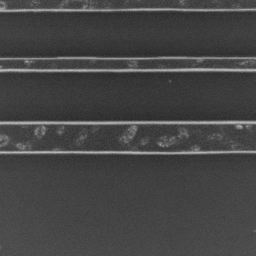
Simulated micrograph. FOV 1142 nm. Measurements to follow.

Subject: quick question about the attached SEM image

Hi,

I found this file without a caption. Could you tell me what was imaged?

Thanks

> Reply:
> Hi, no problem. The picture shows one or a few lines or trenches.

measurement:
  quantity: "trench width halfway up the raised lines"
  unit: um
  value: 0.223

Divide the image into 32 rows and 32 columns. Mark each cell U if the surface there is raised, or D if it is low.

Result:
UUUUUUUUUUUUUUUUUUUUUUUUUUUUUUUU
DDDDDDDDDDDDDDDDDDDDDDDDDDDDDDDD
DDDDDDDDDDDDDDDDDDDDDDDDDDDDDDDD
DDDDDDDDDDDDDDDDDDDDDDDDDDDDDDDD
DDDDDDDDDDDDDDDDDDDDDDDDDDDDDDDD
DDDDDDDDDDDDDDDDDDDDDDDDDDDDDDDD
DDDDDDDDDDDDDDDDDDDDDDDDDDDDDDDD
UUUUUUUUUUUUUUUUUUUUUUUUUUUUUUUU
UUUUUUUUUUUUUUUUUUUUUUUUUUUUUUUU
DDDDDDDDDDDDDDDDDDDDDDDDDDDDDDDD
DDDDDDDDDDDDDDDDDDDDDDDDDDDDDDDD
DDDDDDDDDDDDDDDDDDDDDDDDDDDDDDDD
DDDDDDDDDDDDDDDDDDDDDDDDDDDDDDDD
DDDDDDDDDDDDDDDDDDDDDDDDDDDDDDDD
DDDDDDDDDDDDDDDDDDDDDDDDDDDDDDDD
UUUUUUUUUUUUUUUUUUUUUUUUUUUUUUUU
UUUUUUUUUUUUUUUUUUUUUUUUUUUUUUUU
UUUUUUUUUUUUUUUUUUUUUUUUUUUUUUUU
UUUUUUUUUUUUUUUUUUUUUUUUUUUUUUUU
DDDDDDDDDDDDDDDDDDDDDDDDDDDDDDDD
DDDDDDDDDDDDDDDDDDDDDDDDDDDDDDDD
DDDDDDDDDDDDDDDDDDDDDDDDDDDDDDDD
DDDDDDDDDDDDDDDDDDDDDDDDDDDDDDDD
DDDDDDDDDDDDDDDDDDDDDDDDDDDDDDDD
DDDDDDDDDDDDDDDDDDDDDDDDDDDDDDDD
DDDDDDDDDDDDDDDDDDDDDDDDDDDDDDDD
DDDDDDDDDDDDDDDDDDDDDDDDDDDDDDDD
DDDDDDDDDDDDDDDDDDDDDDDDDDDDDDDD
DDDDDDDDDDDDDDDDDDDDDDDDDDDDDDDD
DDDDDDDDDDDDDDDDDDDDDDDDDDDDDDDD
DDDDDDDDDDDDDDDDDDDDDDDDDDDDDDDD
DDDDDDDDDDDDDDDDDDDDDDDDDDDDDDDD